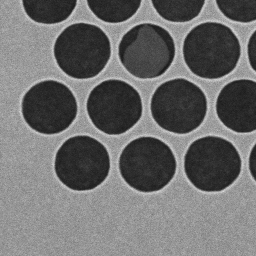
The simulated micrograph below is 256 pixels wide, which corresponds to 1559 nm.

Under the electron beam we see a regular array of holes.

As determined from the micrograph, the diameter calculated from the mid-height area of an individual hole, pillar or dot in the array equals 0.337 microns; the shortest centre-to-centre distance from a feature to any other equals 0.393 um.